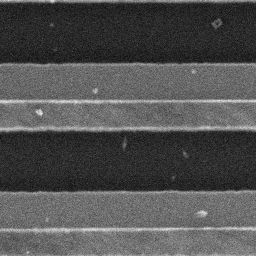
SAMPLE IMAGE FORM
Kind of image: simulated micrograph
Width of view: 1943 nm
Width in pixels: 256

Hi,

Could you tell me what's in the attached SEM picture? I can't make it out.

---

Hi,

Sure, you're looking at lines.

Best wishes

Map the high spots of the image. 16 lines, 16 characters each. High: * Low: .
................
................
................
................
****************
****************
****************
****************
................
................
................
................
****************
****************
****************
****************